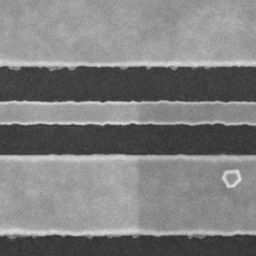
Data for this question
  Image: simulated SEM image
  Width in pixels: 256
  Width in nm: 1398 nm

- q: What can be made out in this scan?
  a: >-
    lines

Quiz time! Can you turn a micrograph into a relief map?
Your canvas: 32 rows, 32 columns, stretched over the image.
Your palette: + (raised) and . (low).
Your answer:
++++++++++++++++++++++++++++++++
++++++++++++++++++++++++++++++++
++++++++++++++++++++++++++++++++
++++++++++++++++++++++++++++++++
++++++++++++++++++++++++++++++++
++++++++++++++++++++++++++++++++
++++++++++++++++++++++++++++++++
++++++++++++++++++++++++++++++++
................................
................................
................................
................................
................................
++++++++++++++++++++++++++++++++
++++++++++++++++++++++++++++++++
+++++.++++++++++.++++++++++.++++
................................
................................
................................
++++++++++++++++++++++++++++++++
++++++++++++++++++++++++++++++++
++++++++++++++++++++++++++++++++
++++++++++++++++++++++++++++++++
++++++++++++++++++++++++++++++++
++++++++++++++++++++++++++++++++
++++++++++++++++++++++++++++++++
++++++++++++++++++++++++++++++++
++++++++++++++++++++++++++++++++
++++++++++++++++++++++++++++++++
................................
................................
................................